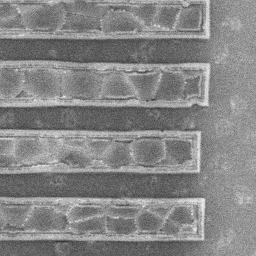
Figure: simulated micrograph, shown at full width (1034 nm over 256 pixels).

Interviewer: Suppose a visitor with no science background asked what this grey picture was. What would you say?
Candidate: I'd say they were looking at one or a few lines or trenches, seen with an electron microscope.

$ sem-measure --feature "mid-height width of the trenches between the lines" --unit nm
113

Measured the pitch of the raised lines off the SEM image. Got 271 nm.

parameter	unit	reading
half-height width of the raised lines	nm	157